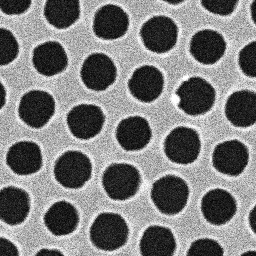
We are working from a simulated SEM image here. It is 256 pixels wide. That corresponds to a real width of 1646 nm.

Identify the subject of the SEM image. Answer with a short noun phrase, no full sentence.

a regular array of holes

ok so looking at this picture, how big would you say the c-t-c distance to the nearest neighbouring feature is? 319 nanometres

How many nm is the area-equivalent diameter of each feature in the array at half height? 240